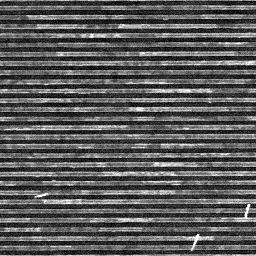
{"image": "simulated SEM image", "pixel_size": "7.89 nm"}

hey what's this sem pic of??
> parallel lines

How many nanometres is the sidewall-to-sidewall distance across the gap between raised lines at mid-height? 41.4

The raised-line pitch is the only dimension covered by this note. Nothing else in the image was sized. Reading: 72.9 nm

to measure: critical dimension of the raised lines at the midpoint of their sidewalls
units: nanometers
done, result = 33.5